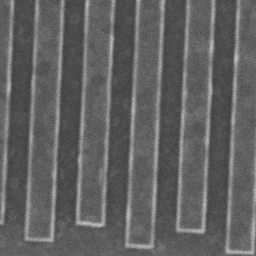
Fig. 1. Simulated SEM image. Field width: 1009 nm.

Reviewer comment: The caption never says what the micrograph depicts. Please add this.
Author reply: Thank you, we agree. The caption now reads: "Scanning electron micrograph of parallel lines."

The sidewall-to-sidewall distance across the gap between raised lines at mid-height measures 87.1 nanometers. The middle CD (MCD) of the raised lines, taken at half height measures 112 nm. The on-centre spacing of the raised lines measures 198 nm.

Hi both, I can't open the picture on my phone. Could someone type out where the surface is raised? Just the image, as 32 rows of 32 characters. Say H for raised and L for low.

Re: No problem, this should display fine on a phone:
HHLLLHHHLLLHHHLLLHHHHLLHHHHLLLHH
HHLLHHHHLLLHHHLLLHHHLLLHHHHLLLHH
HHLLHHHHLLLHHHLLLHHHLLLHHHHLLLHH
HHLLHHHHLLLHHHLLLHHHLLLHHHHLLLHH
HLLLHHHHLLLHHHLLLHHHLLLHHHHLLLHH
HLLLHHHHLLLHHHLLLHHHLLLHHHHLLLHH
HLLLHHHHLLLHHHLLLHHHLLLHHHHLLHHH
HLLLHHHHLLLHHHLLLHHHLLLHHHHLLHHH
HLLLHHHHLLHHHHLLLHHHLLLHHHLLLHHH
HLLLHHHHLLHHHHLLLHHHLLLHHHLLLHHH
HLLLHHHHLLHHHHLLLHHHLLLHHHLLLHHH
HLLLHHHLLLHHHHLLLHHHLLLHHHHLLHHH
HLLLHHHLLLHHHHLLLHHHLLLHHHLLLHHH
HLLLHHHLLLHHHHLLHHHHLLLHHHLLLHHH
HLLLHHHLLLHHHHLLHHHHLLLHHHLLLHHH
HLLLHHHLLLHHHHLLHHHHLLLHHHLLLHHH
HLLLHHHLLLHHHHLLHHHHLLLHHHLLLHHH
HLLLHHHLLLHHHHLLHHHHLLHHHHLLLHHH
HLLLHHHLLLHHHLLLHHHHLLHHHHLLLHHH
HLLLHHHLLLHHHLLLHHHHLLHHHHLLLHHH
HLLLHHHLLLHHHLLLHHHHLLHHHHLLLHHH
HLLLHHHLLLHHHLLLHHHHLLHHHHLLLHHH
HLLLHHHLLLHHHLLLHHHHLLHHHHLLLHHH
HLLHHHHLLLHHHLLLHHHHLLHHHHLLLHHH
HLLHHHHLLLHHHLLLHHHHLLHHHHLLLHHH
HLLHHHHLLLHHHLLLHHHLLLHHHHLLLHHH
LLLHHHHLLLHHHLLLHHHLLLHHHHLLHHHH
LLLHHHHLLLHHHLLLHHHLLLHHHHLLHHHH
LLLHHHHLLLLLLLLLHHHLLLHHHHLLHHHH
LLLHHHHLLLLLLLLLHHHLLLLLLLLLHHHH
LLLLLLLLLLLLLLLLHHHLLLLLLLLLHHHH
LLLLLLLLLLLLLLLLLLLLLLLLLLLLLHHL